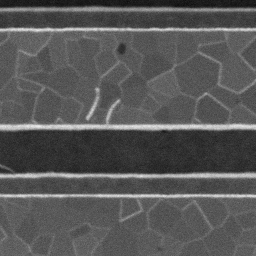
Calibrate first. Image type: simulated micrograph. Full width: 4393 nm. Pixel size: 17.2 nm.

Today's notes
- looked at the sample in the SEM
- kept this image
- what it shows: lines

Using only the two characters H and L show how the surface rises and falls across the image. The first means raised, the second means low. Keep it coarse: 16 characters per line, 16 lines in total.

LLLLLLLLLLLLLLLL
LLLLLLLLLLLLLLLL
HHHHHHHHHHHHHHHH
HHHHHHHHHHHHHHHH
HHHHHHHHHHHHHHHH
HHHHHHHHHHHHHHHH
HHHHHHHHHHHHHHHH
HHHHHHHHHHHHHHHH
LLLLLLLLLLLLLLLL
LLLLLLLLLLLLLLLL
LLLLLLLLLLLLLLLL
LLLLLLLLLLLLLLLL
HHHHHHHHHHHHHHHH
HHHHHHHHHHHHHHHH
HHHHHHHHHHHHHHHH
HHHHHHHHHHHHHHHH